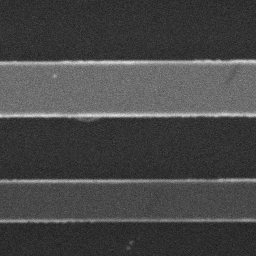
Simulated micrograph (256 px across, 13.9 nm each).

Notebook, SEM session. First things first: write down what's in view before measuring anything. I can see lines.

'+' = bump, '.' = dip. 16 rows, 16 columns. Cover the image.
................
................
................
................
++++++++++++++++
++++++++++++++++
++++++++++++++++
................
................
................
................
++++++++++++++++
++++++++++++++++
++++++++++++++++
................
................